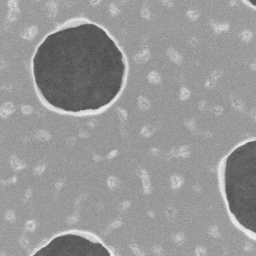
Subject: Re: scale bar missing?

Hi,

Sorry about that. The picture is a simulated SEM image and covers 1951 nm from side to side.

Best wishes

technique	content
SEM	holes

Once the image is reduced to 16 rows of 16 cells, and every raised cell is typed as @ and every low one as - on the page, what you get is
@@@@@@@@@@@@@@@@
@@@@@-@@@@@@@@@@
@@@----@@@@@@@@@
@@------@@@@@@@@
@@------@@@@@@@@
@@------@@@@@@@@
@@@----@@@@@@@@@
@@@@@@@@@@@@@@@@
@@@@@@@@@@@@@@@@
@@@@@@@@@@@@@@@-
@@@@@@@@@@@@@@--
@@@@@@@@@@@@@@--
@@@@@@@@@@@@@@--
@@@@@@@@@@@@@@@-
@@@@@@@@@@@@@@@@
@@@----@@@@@@@@@